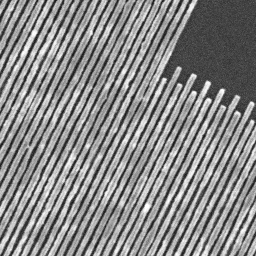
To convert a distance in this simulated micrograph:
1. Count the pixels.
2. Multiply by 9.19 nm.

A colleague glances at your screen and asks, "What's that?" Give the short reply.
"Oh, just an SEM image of parallel lines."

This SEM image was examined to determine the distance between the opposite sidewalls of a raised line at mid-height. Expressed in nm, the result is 40.2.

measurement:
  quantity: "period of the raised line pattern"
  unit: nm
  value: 74.3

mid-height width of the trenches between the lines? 32 nm